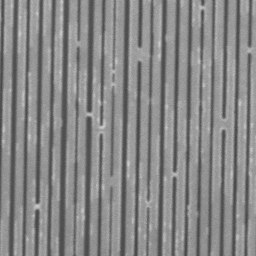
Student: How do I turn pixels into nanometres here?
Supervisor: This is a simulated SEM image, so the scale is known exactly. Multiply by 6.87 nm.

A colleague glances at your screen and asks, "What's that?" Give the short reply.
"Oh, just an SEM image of parallel lines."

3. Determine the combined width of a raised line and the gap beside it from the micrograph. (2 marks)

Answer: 85.1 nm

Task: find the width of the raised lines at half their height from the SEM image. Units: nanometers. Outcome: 61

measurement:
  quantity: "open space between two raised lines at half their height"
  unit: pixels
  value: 3.62